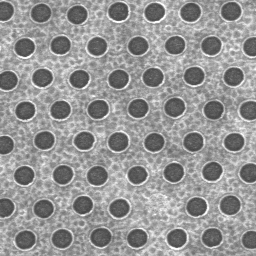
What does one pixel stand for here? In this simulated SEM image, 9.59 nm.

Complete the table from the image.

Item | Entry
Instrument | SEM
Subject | a regular array of holes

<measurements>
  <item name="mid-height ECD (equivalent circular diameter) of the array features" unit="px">20.4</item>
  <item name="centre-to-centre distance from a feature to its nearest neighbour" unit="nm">333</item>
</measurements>